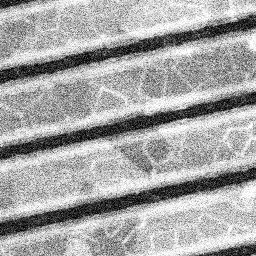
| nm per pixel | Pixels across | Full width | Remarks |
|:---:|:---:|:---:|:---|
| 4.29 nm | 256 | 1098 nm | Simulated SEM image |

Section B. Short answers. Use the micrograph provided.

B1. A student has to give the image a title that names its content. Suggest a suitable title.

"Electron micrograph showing one or a few lines or trenches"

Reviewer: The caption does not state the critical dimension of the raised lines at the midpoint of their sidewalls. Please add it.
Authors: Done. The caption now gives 0.199 microns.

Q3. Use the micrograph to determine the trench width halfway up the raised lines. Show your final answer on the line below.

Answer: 118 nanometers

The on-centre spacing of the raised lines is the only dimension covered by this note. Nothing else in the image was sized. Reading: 0.317 microns